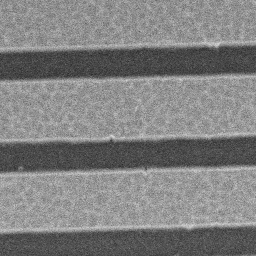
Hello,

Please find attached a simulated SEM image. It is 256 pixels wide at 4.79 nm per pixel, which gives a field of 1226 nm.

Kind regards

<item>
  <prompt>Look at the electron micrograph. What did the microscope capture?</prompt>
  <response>one or a few lines or trenches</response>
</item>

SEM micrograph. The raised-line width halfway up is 279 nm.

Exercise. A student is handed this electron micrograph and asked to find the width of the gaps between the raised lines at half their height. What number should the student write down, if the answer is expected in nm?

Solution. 156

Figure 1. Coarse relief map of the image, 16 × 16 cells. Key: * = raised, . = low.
****************
****************
****************
................
................
****************
****************
****************
**************..
................
...............*
****************
****************
****************
................
................